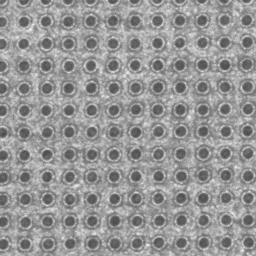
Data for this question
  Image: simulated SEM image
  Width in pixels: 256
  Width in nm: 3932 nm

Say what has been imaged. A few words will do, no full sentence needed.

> a regular array of raised bodies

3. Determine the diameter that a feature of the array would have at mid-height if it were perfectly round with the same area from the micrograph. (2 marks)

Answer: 12.3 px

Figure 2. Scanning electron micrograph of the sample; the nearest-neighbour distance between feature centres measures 335 nm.